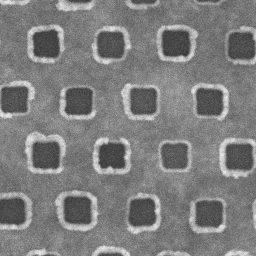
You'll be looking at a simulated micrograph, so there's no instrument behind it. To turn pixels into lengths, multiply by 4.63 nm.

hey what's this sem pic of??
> a regular array of holes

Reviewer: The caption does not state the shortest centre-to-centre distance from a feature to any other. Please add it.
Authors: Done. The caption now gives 292 nm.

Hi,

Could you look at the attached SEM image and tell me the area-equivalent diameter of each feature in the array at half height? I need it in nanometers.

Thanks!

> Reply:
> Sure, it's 144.